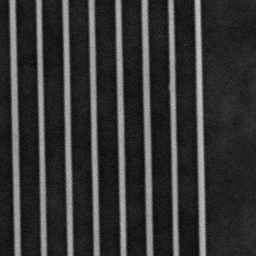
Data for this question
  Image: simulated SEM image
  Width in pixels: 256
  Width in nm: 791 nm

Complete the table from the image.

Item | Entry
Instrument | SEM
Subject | parallel lines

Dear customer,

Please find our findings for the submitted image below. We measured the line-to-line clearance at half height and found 22.1 pixels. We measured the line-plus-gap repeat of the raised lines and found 81.6 nm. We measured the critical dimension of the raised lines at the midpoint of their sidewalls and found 14.3 nanometres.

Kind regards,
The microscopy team